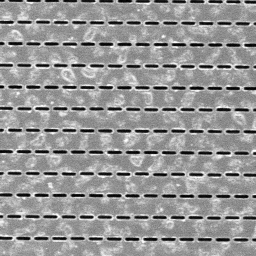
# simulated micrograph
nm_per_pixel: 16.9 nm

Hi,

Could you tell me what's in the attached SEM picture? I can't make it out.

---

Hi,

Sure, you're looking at a regular array of holes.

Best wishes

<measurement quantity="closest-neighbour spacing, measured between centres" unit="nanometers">302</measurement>